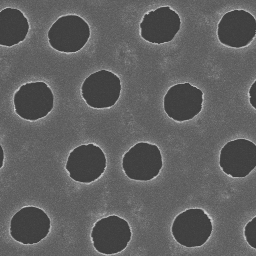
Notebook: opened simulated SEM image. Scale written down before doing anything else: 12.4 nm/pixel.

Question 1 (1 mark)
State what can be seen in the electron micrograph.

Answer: a regular array of holes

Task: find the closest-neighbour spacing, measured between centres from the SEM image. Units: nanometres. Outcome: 876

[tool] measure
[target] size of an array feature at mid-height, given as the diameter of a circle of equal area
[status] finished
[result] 0.48 microns